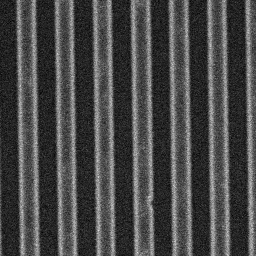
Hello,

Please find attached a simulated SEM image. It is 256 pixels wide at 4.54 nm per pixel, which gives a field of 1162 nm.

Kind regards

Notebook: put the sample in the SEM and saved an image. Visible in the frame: parallel lines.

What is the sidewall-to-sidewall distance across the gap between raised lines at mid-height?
0.102 microns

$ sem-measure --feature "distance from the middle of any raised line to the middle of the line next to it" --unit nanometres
173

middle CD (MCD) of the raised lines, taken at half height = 73.2 nm